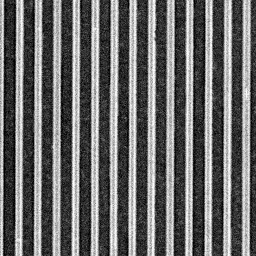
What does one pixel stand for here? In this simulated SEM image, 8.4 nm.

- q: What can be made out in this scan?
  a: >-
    parallel lines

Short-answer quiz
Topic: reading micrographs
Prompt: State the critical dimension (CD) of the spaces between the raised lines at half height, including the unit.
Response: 110 nm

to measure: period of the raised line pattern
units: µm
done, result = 0.159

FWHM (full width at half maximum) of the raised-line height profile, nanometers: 54.6